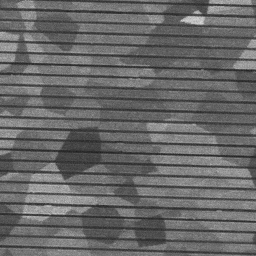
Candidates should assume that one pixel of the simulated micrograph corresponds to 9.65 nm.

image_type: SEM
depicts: parallel lines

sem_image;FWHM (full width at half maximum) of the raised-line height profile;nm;73.6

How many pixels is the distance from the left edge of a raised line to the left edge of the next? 10.8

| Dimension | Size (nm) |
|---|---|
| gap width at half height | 32.6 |